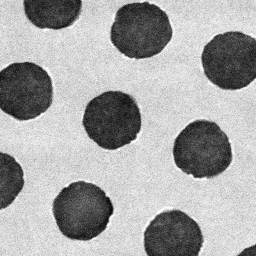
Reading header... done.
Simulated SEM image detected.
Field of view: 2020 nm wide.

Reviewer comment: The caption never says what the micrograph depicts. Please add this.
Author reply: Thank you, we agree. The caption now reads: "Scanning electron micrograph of holes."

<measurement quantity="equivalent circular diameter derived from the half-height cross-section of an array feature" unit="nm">461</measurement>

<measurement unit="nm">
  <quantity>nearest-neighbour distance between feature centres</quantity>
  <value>746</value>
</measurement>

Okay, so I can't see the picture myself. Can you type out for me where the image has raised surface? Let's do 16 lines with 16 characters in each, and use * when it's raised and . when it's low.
**...***..******
**..***....*****
*******....**...
********..***...
...**********...
...***********.*
...***..********
*****....*******
******...**...**
***********...**
.**********...**
.***..**********
.**....*********
***....***..****
****..***....***
*********....**.